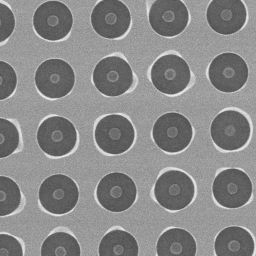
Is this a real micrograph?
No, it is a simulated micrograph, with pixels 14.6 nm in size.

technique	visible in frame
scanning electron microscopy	an array of small figures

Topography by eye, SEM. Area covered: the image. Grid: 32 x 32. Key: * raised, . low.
.****...****....***....***.....*
..**.....**.....**......**..*..*
..**.....**.....***.....**.....*
..**.....***....***....***....**
.****...*****..*****..**********
********************************
********************************
******..*****...****...****...**
..***....***....***.....**.....*
..**.....***.....**..*..**.....*
..**.....***.....**.....**.....*
..***....****...****...*****.***
********************************
********************************
******.******...****...****....*
..***....***.....**.....**.....*
..***.....**.....**.....**.....*
...**.....**.....**.....***....*
..***....***....****...****...**
.*****..************************
********************************
********************...****....*
..****...****....***....***....*
..***.....**..*..**.....***.....
...**.....**..*..**.....***....*
...**.....**.....***....***....*
..****...*****.*****************
********************************
**************.*************..**
..****...****....***....***.....
...**.....**.....***.....**.....
...**.....**.....***.....**.....